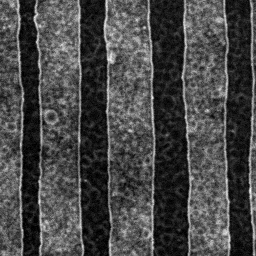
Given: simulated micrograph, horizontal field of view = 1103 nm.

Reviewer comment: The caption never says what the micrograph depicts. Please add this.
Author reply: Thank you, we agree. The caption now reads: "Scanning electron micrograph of one or a few lines or trenches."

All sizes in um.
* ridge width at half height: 0.169